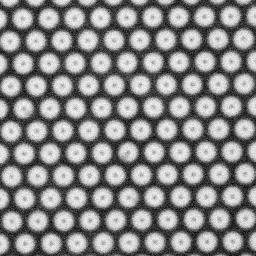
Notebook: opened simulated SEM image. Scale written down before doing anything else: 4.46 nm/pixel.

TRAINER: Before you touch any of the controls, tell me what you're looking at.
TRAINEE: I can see an array of small figures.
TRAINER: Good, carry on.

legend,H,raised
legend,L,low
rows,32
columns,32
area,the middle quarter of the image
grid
HHHHHLLHHHHLLLHHHHLLHHHHLLLHHHHL
LHHHLLLLHHHLLLHHHLLLLHHHLLLLHHLL
LLLLLLLLLLLLLLLLLLLLLLLLLLLLLLLL
HLLLLHHHLLLHHHLLLHHHHLLLHHHLLLHH
HHLLHHHHLLHHHHHLLHHHHLLHHHHHLLHH
HHLLHHHHLLHHHHHLLHHHHLLHHHHHLLHH
HHLLHHHHLLLHHHHLLHHHHLLLHHHHLLHH
HLLLLHHLLLLLHHLLLLLLLLLLLLLLLLLL
LLLLLLLLLLLLLLLLLLLLLLLLLLLLLLLL
LHHHHLLLHHHLLLHHHHLLHHHHLLLHHHHL
LHHHHLLHHHHHLLHHHHLLHHHHHLLHHHHL
LHHHHLLHHHHHLLHHHHLLHHHHHLLHHHHL
LHHHHLLLHHHLLLHHHHLLLHHHLLLHHHHL
LLLLLLLLLLLLLLLLLLLLLLLLLLLLLLLL
LLLLLHHLLLLHHHLLLLHHLLLLHHHLLLLH
HHLLHHHHLLLHHHHLLHHHHLLLHHHHLLHH
HHLLHHHHHLHHHHHLLHHHHLLHHHHHLLHH
HHLLHHHHHLLHHHHLLHHHHLLLHHHHLLHH
HLLLLHHHLLLHHHLLLLHHHLLLLHHLLLLH
LLLLLLLLLLLLLLLLLLLLLLLLLLLLLLLL
LHHHHLLLHHHLLLHHHHLLLHHHLLLHHHHL
LHHHHLLHHHHHLLHHHHLLHHHHHLLHHHHL
LHHHHLLHHHHHLLHHHHLLHHHHHLLHHHHL
LHHHHLLLHHHLLLHHHHLLLHHHLLLHHHHL
LLHHLLLLLHLLLLLLLLLLLLLLLLLLLLLL
LLLLLLLLLLLLLLLLLLLHLLLLLHHLLLLH
HHLLHHHHLLLHHHHLLHHHHLLLHHHHLLHH
HHLLHHHHHLLHHHHLLHHHHHLLHHHHLLHH
HHLLHHHHHLLHHHHLLHHHHHLLHHHHLLHH
HHLLLHHHLLLHHHLLLLHHHLLLHHHLLLLH
LLLLLLLLLLLLLLLLLLLLLLLLLLLLLLLL
LLHHLLLLHHHLLLLHHHLLLHHHLLLLHHHL